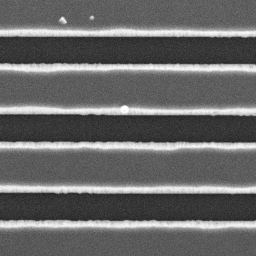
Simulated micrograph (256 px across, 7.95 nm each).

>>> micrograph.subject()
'lines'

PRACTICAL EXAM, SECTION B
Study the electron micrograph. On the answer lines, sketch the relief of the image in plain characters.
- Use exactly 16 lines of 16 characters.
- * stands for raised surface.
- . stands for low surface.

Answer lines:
****************
****************
................
................
****************
****************
****************
................
................
****************
****************
****************
................
................
****************
****************